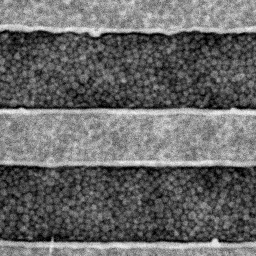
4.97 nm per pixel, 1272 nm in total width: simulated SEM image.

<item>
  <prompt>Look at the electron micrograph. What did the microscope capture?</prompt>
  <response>one or a few lines or trenches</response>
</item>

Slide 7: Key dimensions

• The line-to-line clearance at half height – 398 nm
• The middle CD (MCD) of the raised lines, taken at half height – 0.265 microns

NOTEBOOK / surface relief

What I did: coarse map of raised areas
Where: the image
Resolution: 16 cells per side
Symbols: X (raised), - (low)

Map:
XXXXXXXXXXXXXXXX
XXXXXXXXXXXXXXXX
----------------
----------------
----------------
----------------
----------------
XXXXXXXXXXXXXXXX
XXXXXXXXXXXXXXXX
XXXXXXXXXXXXXXXX
----------------
----------------
----------------
----------------
----------------
XXXXXXXXXXXXXXXX